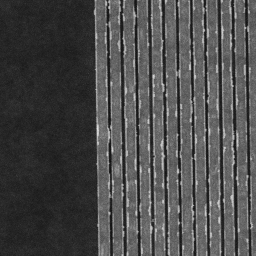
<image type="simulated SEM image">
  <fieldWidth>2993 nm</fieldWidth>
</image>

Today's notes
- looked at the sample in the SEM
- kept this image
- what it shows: parallel lines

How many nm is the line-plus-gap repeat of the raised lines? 162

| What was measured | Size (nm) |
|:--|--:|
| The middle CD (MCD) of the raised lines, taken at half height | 124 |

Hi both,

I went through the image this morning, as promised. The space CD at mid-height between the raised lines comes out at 33.6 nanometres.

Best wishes